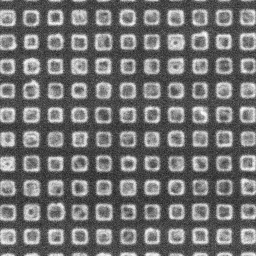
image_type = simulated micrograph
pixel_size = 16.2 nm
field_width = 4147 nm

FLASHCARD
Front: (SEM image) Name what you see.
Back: a regular array of raised bodies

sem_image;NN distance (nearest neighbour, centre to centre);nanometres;383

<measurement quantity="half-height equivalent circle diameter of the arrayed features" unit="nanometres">242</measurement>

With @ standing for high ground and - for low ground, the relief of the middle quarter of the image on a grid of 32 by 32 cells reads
--@@@---@@@@---@@----@@---@@@---
--@@@---@@@@---@@----@@---@@@@--
--------------------------------
--------------------------------
--------------------------------
--@@@---@@@@--@@@@--@@@@--@@@@--
--@@@---@@@@--@@@@--@@@@--@@@@--
--@@@---@@@---@@@---@@@@--@@@@--
--------------------------------
--------------------------------
--------------------------------
--@@@----@@----@@----@@@--@@@@--
--@@@@--@@@@--@@@----@@@--@@@@--
--@@@@--@@@@--@@@@---@@@--@@@@--
--------------------------------
--------------------------------
--------------------------------
---@@@---@@---@@@----@@----@@@--
--@@@@---@@---@@@----@@----@@@--
--@@@----@@---@@@----@@----@@@--
--------------------------------
--------------------------------
--------------------------------
---@@----@@---@@@@---@-----@@---
--@@@---@@@---@@@@---@@----@@@--
--@@@---@@@----@@@---@@----@@@--
--------------------------------
--------------------------------
--------------------------------
---------@@---@@@@---@@----@@@--
--@@@----@@---@@@@---@@----@@@--
--@@@----@@---@@@@---@@----@@@--